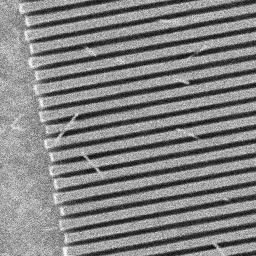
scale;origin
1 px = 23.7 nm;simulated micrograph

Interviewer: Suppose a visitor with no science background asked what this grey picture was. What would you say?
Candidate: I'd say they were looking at parallel lines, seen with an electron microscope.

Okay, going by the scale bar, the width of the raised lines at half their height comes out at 201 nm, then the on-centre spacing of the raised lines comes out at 327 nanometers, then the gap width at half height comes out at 122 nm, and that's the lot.